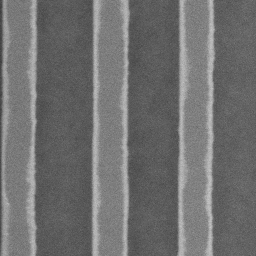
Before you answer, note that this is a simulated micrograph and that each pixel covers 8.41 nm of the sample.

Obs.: lines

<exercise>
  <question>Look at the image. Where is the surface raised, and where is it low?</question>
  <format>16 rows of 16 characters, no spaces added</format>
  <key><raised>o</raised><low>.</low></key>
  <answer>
oo....oo...oo...
oo....oo...oo...
oo....oo...oo...
oo....oo...oo...
oo....oo...oo...
oo....oo...oo...
oo....oo...oo...
oo....oo...oo...
oo....oo...oo...
oo....oo...oo...
oo....oo...oo...
oo....oo...oo...
oo....oo...oo...
oo....oo...oo...
oo....oo...oo...
oo....oo...oo...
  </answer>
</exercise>